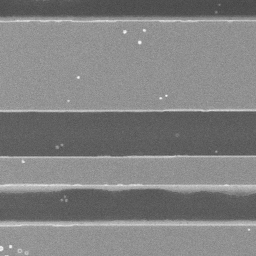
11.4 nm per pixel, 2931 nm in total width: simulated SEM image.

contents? lines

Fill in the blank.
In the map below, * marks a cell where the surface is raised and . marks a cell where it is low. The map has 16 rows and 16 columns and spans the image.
................
****************
****************
****************
****************
****************
****************
................
................
................
****************
****************
................
................
****************
****************